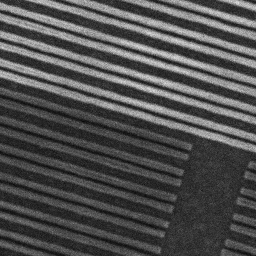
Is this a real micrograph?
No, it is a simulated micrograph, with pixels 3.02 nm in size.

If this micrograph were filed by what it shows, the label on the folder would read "parallel lines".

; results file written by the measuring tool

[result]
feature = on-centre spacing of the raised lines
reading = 40.7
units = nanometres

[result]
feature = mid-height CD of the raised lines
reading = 6.09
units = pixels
